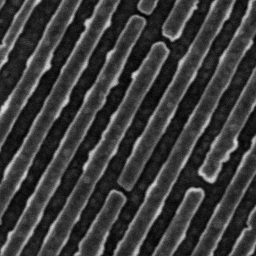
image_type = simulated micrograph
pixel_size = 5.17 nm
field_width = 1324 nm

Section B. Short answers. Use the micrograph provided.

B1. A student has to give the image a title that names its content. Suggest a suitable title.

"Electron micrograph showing parallel lines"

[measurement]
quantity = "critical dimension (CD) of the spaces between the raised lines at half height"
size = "77 nm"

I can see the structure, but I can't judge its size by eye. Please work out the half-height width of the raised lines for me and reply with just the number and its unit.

95.2 nm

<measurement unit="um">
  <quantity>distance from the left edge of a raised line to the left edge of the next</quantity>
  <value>0.174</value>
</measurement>